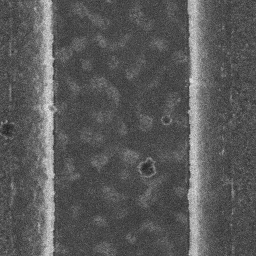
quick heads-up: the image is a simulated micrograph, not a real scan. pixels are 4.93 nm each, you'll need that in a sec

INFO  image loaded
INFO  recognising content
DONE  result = one or a few lines or trenches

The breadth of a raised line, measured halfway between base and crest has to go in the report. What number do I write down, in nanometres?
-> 728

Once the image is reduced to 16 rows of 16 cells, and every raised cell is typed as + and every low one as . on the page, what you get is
...+++++++++....
...+++++++++....
...+++++++++....
...+++++++++....
...+++++++++....
...+++++++++....
...+++++++++....
...+++++++++....
...+++++++++....
...+++++++++....
...+++++++++....
...+++++++++....
...+++++++++....
...+++++++++....
...+++++++++....
...+++++++++....